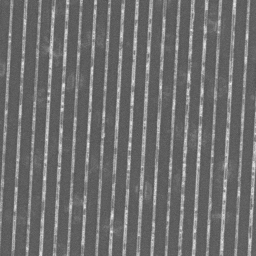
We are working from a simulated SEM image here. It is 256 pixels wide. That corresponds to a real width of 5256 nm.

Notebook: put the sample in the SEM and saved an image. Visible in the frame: parallel lines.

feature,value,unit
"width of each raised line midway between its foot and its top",51.2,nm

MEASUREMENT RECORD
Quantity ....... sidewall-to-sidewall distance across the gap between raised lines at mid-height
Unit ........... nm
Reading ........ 241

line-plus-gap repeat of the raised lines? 285 nanometres